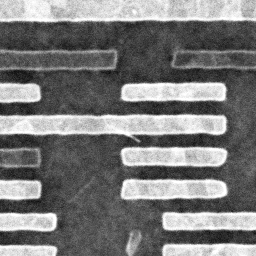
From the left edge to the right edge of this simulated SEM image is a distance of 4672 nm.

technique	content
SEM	wiring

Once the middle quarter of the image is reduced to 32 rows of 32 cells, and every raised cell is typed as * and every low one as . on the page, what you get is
*************..............*****
................................
................................
................................
................................
...............*****************
...............*****************
...............*****************
...............*****************
................................
................................
................................
................................
********************************
********************************
********************************
********************************
...............**...............
................................
................................
................................
...............*****************
...............*****************
...............*****************
...............*****************
................................
................................
................................
................................
...............*****************
...............*****************
...............*****************